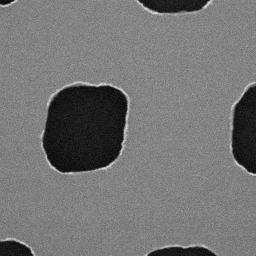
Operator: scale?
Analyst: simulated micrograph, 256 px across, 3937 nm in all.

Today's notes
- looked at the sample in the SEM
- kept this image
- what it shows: holes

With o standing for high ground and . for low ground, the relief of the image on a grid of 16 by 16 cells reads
ooooooooo....ooo
oooooooooooooooo
oooooooooooooooo
oooooooooooooooo
oooooooooooooooo
oooo...ooooooooo
ooo.....ooooooo.
ooo.....ooooooo.
ooo.....oooooo..
ooo....oooooooo.
ooo...ooooooooo.
oooooooooooooooo
oooooooooooooooo
oooooooooooooooo
oooooooooooooooo
..oooooooo...ooo